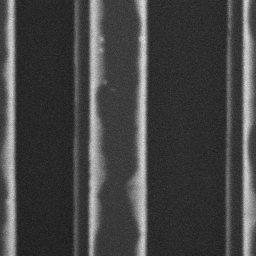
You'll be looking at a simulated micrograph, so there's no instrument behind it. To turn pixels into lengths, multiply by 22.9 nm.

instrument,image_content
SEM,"lines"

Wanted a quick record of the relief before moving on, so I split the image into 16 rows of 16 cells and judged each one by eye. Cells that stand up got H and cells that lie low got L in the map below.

HLLLLLHHHLLLLLLH
HLLLLLHHHLLLLLLH
HLLLLLHHHLLLLLLH
HLLLLLHHHLLLLLLH
HLLLLLHHHLLLLLLH
HLLLLLHHHLLLLLLH
HLLLLLHHHLLLLLLH
HLLLLLHHHLLLLLLH
HLLLLLHHHLLLLLLH
HLLLLLHHHLLLLLLH
HLLLLLHHHLLLLLLH
HLLLLLHHHLLLLLLH
HLLLLLHHHLLLLLLH
HLLLLLHHHLLLLLLH
HLLLLLHHHLLLLLLH
HLLLLLHHHLLLLLLH